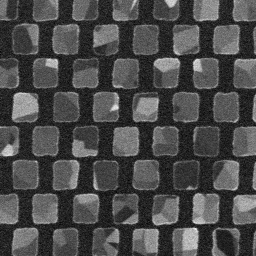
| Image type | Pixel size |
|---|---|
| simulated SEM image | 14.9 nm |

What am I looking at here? a regular array of raised bodies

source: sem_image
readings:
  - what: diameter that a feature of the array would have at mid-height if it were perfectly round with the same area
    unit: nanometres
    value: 438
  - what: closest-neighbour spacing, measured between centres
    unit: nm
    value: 579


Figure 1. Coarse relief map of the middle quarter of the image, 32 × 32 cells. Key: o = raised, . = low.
..oooooo.....ooooo.....oooooo...
....oooo....oooooo.....oooooo...
...ooooo....oooooo......ooooo...
..oooooo....oooooo.....ooooo....
..oooooo....oooooo.....ooooo....
...ooooo.....ooooo.....ooooo....
................................
ooo.....ooooo.....ooooo.....oooo
ooo.....oooooo...oooooo....ooooo
ooo.....ooooo....oooooo....ooooo
oooo...oooooo....oooooo....ooooo
oooo...oooooo....oooooo.....oooo
oooo...ooooooo...oooooo....ooooo
ooo....ooooooo...oooooo....ooooo
................................
................................
...ooooo.....ooooo.....ooooo....
...ooooo.....oooooo....ooooo....
...ooooo.....ooooo....oooooo....
..oooooo....oooooo....oooooo....
..oooooo....oooooo....oooooo....
..oooooo....oooooo....oooooo....
..oooooo.....oo.oo.....ooooo....
................................
ooo.....ooooo.....o.ooo.......oo
oooo....ooooo.....ooooo.....oooo
oooo....ooooo.....ooooo.....oooo
ooo.....ooooo.....ooooo....ooooo
ooo.....ooooo....ooooooo...ooooo
ooo.....ooooo....oooooo.....oooo
ooo.....ooooo....oooooo.....oooo
.........oo.....................